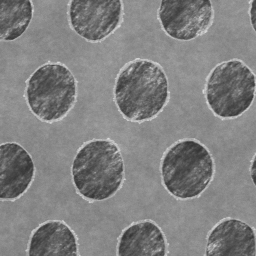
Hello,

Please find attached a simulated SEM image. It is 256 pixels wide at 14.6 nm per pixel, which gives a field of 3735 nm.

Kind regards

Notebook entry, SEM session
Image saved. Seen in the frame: holes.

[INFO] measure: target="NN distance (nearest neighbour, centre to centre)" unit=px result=89.3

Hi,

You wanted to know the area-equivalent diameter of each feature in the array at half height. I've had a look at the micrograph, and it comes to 777 nm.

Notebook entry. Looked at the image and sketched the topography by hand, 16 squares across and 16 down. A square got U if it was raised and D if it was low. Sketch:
DDUUDDDDUUDDDUUU
DDUUUDDUUUDDDUUU
UUUUUUUUUUUUUUUU
UUUUUUUUUUUUUUUU
UUDDUUUUDDUUUDDD
UUDDDUUDDDUUUDDD
UUDDUUUDDDUUUDDD
UUUUUUUUUUUUUUUU
UUUUUUUUUUUUUUUU
DDUUUDDUUUUDDUUU
DDUUUDDDUUDDDUUU
DDUUUDDDUUDDDUUU
UUUUUUUUUUUUUUUU
UUUUUUUUUUUUUUUU
UUDDUUUUDDUUUDDD
UUDDDUUDDDUUUDDD